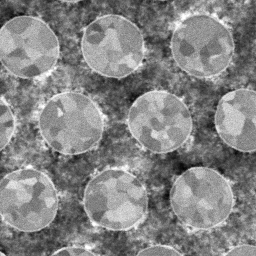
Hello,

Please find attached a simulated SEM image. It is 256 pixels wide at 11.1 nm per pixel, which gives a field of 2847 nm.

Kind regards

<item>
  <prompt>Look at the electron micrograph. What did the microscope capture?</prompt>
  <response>raised bodies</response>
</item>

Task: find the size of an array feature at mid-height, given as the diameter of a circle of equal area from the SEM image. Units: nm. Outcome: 690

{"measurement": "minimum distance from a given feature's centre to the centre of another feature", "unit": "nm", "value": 964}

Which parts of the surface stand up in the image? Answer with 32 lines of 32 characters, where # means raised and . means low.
................................
................................
.####.......####.......####.....
######.....######.....######....
#######...########....#######...
#######...########...########...
#######...########....#######...
#######....#######....#######...
.#####.....######......#####....
..###........###........##......
................................
...................#.........###
......#####......######.....####
#....#######....#######....#####
##...########...########...#####
##...########...########...#####
##...########...########...#####
#.....######.....######.....####
.......####.......####.......###
................................
................................
..###........###.......####.....
######.....######.....######....
#######....#######....#######...
#######....#######...########...
#######....#######...########...
#######....#######....#######...
.######.....#####......#####....
..###........###.........#......
................................
................................
.......####.......####.......###